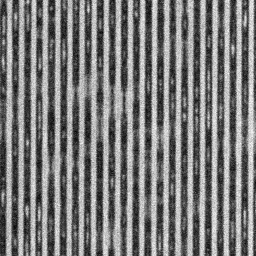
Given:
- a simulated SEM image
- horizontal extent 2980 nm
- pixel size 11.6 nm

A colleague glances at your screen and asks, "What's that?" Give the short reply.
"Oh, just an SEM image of parallel lines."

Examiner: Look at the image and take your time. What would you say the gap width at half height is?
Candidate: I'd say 0.0916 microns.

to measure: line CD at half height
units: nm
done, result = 46.5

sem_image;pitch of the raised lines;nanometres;141